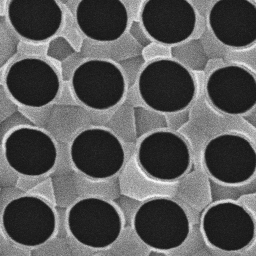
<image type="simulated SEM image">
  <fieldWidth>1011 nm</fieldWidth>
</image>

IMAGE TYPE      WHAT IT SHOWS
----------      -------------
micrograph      a regular array of holes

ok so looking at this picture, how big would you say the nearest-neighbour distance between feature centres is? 0.263 micrometres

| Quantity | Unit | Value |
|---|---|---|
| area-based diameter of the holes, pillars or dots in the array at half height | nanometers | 200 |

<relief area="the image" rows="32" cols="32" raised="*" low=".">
*......***.....***......***....*
*.......**......**......**......
*.......**......**......**......
**.....***......**......**......
***...*****....****.....***.....
****************************...*
********************************
***..******.********************
*.....****.....***.....*****..**
*......**......***......**.....*
*......**.......*.......**......
*......**......***......**......
**.....***.....***......**......
************..*****....****....*
********************************
********************************
**...*****....******.***********
*.....***......***.....***.....*
*......**......***.....***......
*......**.......*.......**......
*......**......***......**......
**....****.....***.....***......
***************************....*
********************************
********************************
*.....****....****....******.***
*......**......**......***.....*
.......**......**......**.......
*......**......**.......*.......
*.....***......**......***......
***..******...****.....***.....*
********************************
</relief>